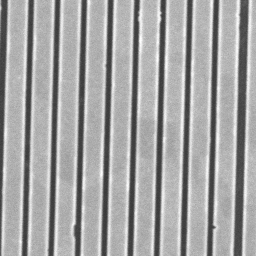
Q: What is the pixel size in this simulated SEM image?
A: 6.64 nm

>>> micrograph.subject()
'parallel lines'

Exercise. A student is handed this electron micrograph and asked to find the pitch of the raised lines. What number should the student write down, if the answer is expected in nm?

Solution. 176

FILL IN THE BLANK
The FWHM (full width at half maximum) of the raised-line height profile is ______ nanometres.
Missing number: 130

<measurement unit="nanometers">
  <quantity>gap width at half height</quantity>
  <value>50.6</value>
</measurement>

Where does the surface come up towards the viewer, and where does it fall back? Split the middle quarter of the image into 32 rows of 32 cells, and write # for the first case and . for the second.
###...####..#####..####..#####..
###...####..#####..####..#####..
###...####..#####..####...####..
###...####..#####..####...####..
###...####..#####..####...####..
###..#####..#####..####..#####..
###..#####..#####..####..#####..
###..#####..#####..####..#####..
###..#####..#####..####..#####..
###..#####..#####..####..#####..
###..#####..#####..####..#####..
###..#####..#####..####..#####..
###..#####..#####.#####..#####..
###..#####..#####.#####..#####..
###..#####..#####.#####..#####..
###..#####..####..#####..#####..
###..#####..####..#####..#####..
###..#####..####..#####..#####..
###..#####..####..#####..#####..
###..#####..####..#####..#####.#
###..#####..####..#####..#####.#
###..#####..####..#####..#####.#
###..#####..####..#####..####..#
###..#####..####..#####..####..#
###..#####..####..#####..####..#
###..#####..####..#####..####..#
###..#####..####..#####..####..#
###..#####.#####..#####..####..#
###..#####.#####..#####..####..#
###..#####.#####..#####..####..#
###..####..#####..#####..####..#
###..####..#####..#####..####..#